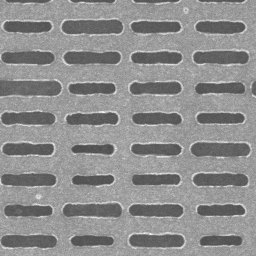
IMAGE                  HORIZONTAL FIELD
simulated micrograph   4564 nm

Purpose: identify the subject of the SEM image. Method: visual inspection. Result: a regular array of holes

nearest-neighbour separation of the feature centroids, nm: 543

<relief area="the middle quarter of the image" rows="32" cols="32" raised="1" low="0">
11111111111111111111111111111111
11111111111111111111111111111111
11111111111111111111111111111111
11111111111111111111111111111111
11111111111111111111100000000111
10000000000001110000000000000111
10000000000001110000000000000111
11000001110011111001110000001111
11111111111111111111111111111111
11111111111111111111111111111111
11111111111111111111111111111111
11111111111111111111111111111111
11000000000001111100000000001111
00000000000000111000000000000111
10000000000001111000000000000111
11111111111111111111111111111111
11111111111111111111111111111111
11111111111111111111111111111111
11111111111111111111111111111111
11111111111111111111111111111111
11000000000011111000000000000111
11000000000001111000000000000111
11111111000011111100000000000111
11111111111111111111111111111111
11111111111111111111111111111111
11111111111111111111111111111111
11111111111111111111111111111111
11111111111111111111000110001111
11000000000001111000000000000111
11000000000011111000000000000111
11111111111111111111111111111111
11111111111111111111111111111111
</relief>